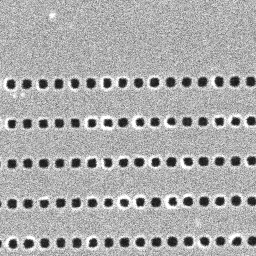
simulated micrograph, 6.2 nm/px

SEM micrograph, a regular array of holes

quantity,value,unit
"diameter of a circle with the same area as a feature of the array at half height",65.7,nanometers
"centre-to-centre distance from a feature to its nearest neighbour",0.0983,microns